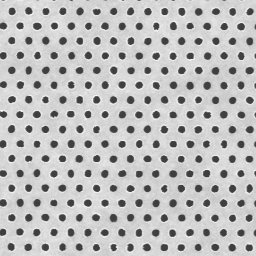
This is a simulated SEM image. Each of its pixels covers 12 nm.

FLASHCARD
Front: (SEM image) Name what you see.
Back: a regular array of holes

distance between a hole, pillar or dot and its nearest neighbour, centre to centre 200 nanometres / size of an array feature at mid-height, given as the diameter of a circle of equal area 7.4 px